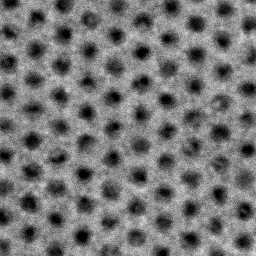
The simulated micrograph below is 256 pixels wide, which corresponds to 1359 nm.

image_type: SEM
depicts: a regular array of raised bodies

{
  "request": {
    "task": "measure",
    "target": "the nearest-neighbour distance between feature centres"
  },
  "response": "160 nm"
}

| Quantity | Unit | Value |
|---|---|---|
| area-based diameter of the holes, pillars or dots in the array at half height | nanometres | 72.4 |